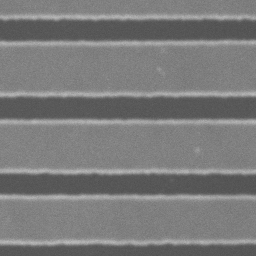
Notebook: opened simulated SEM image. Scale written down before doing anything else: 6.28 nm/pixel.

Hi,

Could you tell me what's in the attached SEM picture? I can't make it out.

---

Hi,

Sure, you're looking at lines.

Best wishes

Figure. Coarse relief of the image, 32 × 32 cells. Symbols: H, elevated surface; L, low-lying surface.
HHHHHHHHHHHHHHHHHHHHHHHHHHHHHHHH
HHHHHHHHHHHHHHHHHHHHHHHHHHHHHHHH
LLLLLLLLLLLLLLLLLLLLLLLLLLLLLHLH
LLLLLLLLLLLLLLLLLLLLLLLLLLLLLLLL
LLLLLLLLLLLLLLLLLLLLLLLLLLLLLLLL
HHHHHHHHHHHHHHHHHHHHHHHHHHHHHHHH
HHHHHHHHHHHHHHHHHHHHHHHHHHHHHHHH
HHHHHHHHHHHHHHHHHHHHHHHHHHHHHHHH
HHHHHHHHHHHHHHHHHHHHHHHHHHHHHHHH
HHHHHHHHHHHHHHHHHHHHHHHHHHHHHHHH
HHHHHHHHHHHHHHHHHHHHHHHHHHHHHHHH
HHHHHHHHHHHHHHHHHHHHHHHHHHHHHHHH
LLLLLLLLLLLLLLLLLLLLLLLLLLLLLLLL
LLLLLLLLLLLLLLLLLLLLLLLLLLLLLLLL
LLLLLLLLLLLLLLLLLLLLLLLLLLLLLLLL
HHHHHHHHHHHHHHHHHHHHHHHHHHHHHHHH
HHHHHHHHHHHHHHHHHHHHHHHHHHHHHHHH
HHHHHHHHHHHHHHHHHHHHHHHHHHHHHHHH
HHHHHHHHHHHHHHHHHHHHHHHHHHHHHHHH
HHHHHHHHHHHHHHHHHHHHHHHHHHHHHHHH
HHHHHHHHHHHHHHHHHHHHHHHHHHHHHHHH
HHHHHHHHHHHHHHHHHHHHHHHHHHHHHHHH
LLLLLLLLLLLLLLLLLLLLLLLLLLLLLLLL
LLLLLLLLLLLLLLLLLLLLLLLLLLLLLLLL
HHHHHHHHHHHHHHHHHHHHHHHHHHHHHHHH
HHHHHHHHHHHHHHHHHHHHHHHHHHHHHHHH
HHHHHHHHHHHHHHHHHHHHHHHHHHHHHHHH
HHHHHHHHHHHHHHHHHHHHHHHHHHHHHHHH
HHHHHHHHHHHHHHHHHHHHHHHHHHHHHHHH
HHHHHHHHHHHHHHHHHHHHHHHHHHHHHHHH
HHHHHHHHHHHLLLHHHHHHHHHLLHHLHLLL
LLLLLLLLLLLLLLLLLLLLLLLLLLLLLLLL